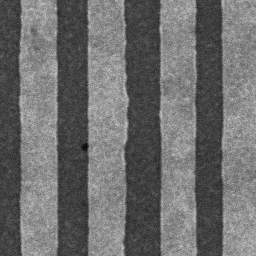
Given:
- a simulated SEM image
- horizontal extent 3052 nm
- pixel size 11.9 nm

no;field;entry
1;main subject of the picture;one or a few lines or trenches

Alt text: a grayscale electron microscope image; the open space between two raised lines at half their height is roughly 388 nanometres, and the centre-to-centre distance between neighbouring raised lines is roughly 831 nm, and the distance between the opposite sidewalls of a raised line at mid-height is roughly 34.5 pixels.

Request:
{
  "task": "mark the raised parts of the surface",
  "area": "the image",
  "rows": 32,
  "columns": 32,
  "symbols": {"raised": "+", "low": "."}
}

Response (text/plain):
...++++....++++.....++++....++++
...++++....++++.....++++....++++
...++++....++++.....++++....++++
...++++....+++++....++++....++++
...++++....+++++....++++....++++
...++++....+++++....++++....++++
...++++....++++.....++++....++++
..+++++....+++++....++++....++++
..+++++....+++++....++++....++++
...++++....+++++....++++....++++
...++++....+++++....++++....++++
...++++....+++++....++++....++++
...++++....+++++....++++....++++
...++++....+++++....++++....++++
...++++....+++++....++++....++++
...++++....+++++....++++....++++
...++++....+++++....++++....++++
...++++....+++++....++++....++++
...++++....++++.....++++....++++
...++++....++++.....++++....++++
...++++....+++++....++++....++++
...++++....+++++....++++....++++
...++++....+++++....++++....++++
...++++....+++++....++++....++++
...++++....+++++....++++....++++
...++++....+++++....++++....++++
...++++....+++++....++++....++++
...++++....+++++....++++....++++
...++++....++++.....++++....++++
...++++....++++.....++++....++++
...++++....++++.....++++....++++
...++++....++++.....++++....++++